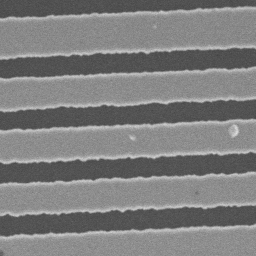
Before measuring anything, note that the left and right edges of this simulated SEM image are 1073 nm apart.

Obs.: lines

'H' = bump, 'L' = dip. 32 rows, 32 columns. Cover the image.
LLLLLLLLLLLLLLLLLLLLLLLLLLLLLLLL
LLLLLLLLLLLLLLLLLHHHHHHHHHHHHHHH
HHHHHHHHHHHHHHHHHHHHHHHHHHHHHHHH
HHHHHHHHHHHHHHHHHHHHHHHHHHHHHHHH
HHHHHHHHHHHHHHHHHHHHHHHHHHHHHHHH
HHHHHHHHHHHHHHHHHHHHHHHHHHHHHHHH
HHHHHHHHHHHHHHHHHHHLLLLLLLLLLLLL
LLLLLLLLLLLLLLLLLLLLLLLLLLLLLLLL
LLLLLLLLLLLLLLLLLLLLLLLLLLLLLLLH
LLLLLLLLHHHHHHHHHHHHHHHHHHHHHHHH
HHHHHHHHHHHHHHHHHHHHHHHHHHHHHHHH
HHHHHHHHHHHHHHHHHHHHHHHHHHHHHHHH
HHHHHHHHHHHHHHHHHHHHHHHHHHHLLHHL
HHHHHHHLLLLLLLLLLLLLLLLLLLLLLLLL
LLLLLLLLLLLLLLLLLLLLLLLLLLLLLLLL
LLLLLLLLLLLLLLLLLLLLHHHHHHHHHHHH
HHHHHHHHHHHHHHHHHHHHHHHHHHHHHHHH
HHHHHHHHHHHHHHHHHHHHHHHHHHHHHHHH
HHHHHHHHHHHHHHHHHHHHHHHHHHHHHHHH
HHHHHHHHHHHHHHHHHHHHHHLLLLLLLLLL
LLLLLLLLLLLLLLLLLLLLLLLLLLLLLLLL
LLLLLLLLLLLLLLLLLLLLLLLLLLLLLLLL
LLLLLLLLLLHLHHHHHHHHHHHHHHHHHHHH
HHHHHHHHHHHHHHHHHHHHHHHHHHHHHHHH
HHHHHHHHHHHHHHHHHHHHHHHHHHHHHHHH
HHHHHHHHHHHHHHHHHHHHHHHHHHHHHHHH
HHHHHHHHHHLHHLLLLLLLLLLLLLLLLLLL
LLLLLLLLLLLLLLLLLLLLLLLLLLLLLLLL
LLLLLLLLLLLLLLLLLLLLLLHHHHHHHHHH
LHHHHHHHHHHHHHHHHHHHHHHHHHHHHHHH
HHHHHHHHHHHHHHHHHHHHHHHHHHHHHHHH
HHHHHHHHHHHHHHHHHHHHHHHHHHHHHHHH